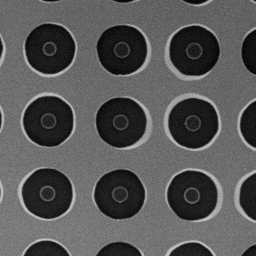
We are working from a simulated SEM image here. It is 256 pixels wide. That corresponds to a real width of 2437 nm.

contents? an array of small figures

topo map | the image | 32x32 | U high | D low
UUUUUUUUUUUUUUUUUUUUUUUUDUUUUUUU
UUUUUUUUUUUUUUUUUUUUUUUUUUUUUUUU
UUUUUUUUUUUUUUUUUUUUUUUUUUUUUUUU
UUUUDDDDUUUUUUDDDUUUUUUDDDUUUUUU
UUUDDDDDDUUUUDDDDDUUUUDDDDDUUUUD
UUUDDDDDDUUUDDDDDDDUUDDDDDDUUUDD
UUUDDDDDDUUUDDDDDDDUUDDDDDDDUUDD
UUUDDDDDDUUUDDDDDDUUUDDDDDDUUUDD
UUUUDDDDUUUUUDDDDDUUUUDDDDDUUUUD
UUUUUUUUUUUUUUUUUUUUUUUDDUUUUUUU
UUUUUUUUUUUUUUUUUUUUUUUUUUUUUUUU
UUUUUUUUUUUUUUUUUUUUUUUUUUUUUUUU
UUUUDDDDUUUUUUDDDUUUUUDDDDUUUUUU
UUUDDDDDDUUUDDDDDDUUUDDDDDDUUUUD
UUUDDDDDDUUUDDDDDDUUUDDDDDDUUUDD
UUUDDDDDDUUUDDDDDDDUUDDDDDDUUUDD
UUUDDDDDDUUUDDDDDDUUUDDDDDDUUUDD
UUUUDDDDUUUUUDDDDDUUUUDDDDDUUUUD
UUUUUUUUUUUUUUUDUUUUUUUDDUUUUUUU
UUUUUUUUUUUUUUUUUUUUUUUUUUUUUUUU
UUUUUUUUUUUUUUUUUUUUUUUUUUUUUUUU
UUUUDDDDUUUUUUDDDUUUUUUDDUUUUUUU
UUUDDDDDDUUUDDDDDDUUUDDDDDDUUUDD
UUUDDDDDDUUUDDDDDDUUUDDDDDDUUUDD
UUUDDDDDDUUUDDDDDDUUUDDDDDDDUUDD
UUUDDDDDDUUUDDDDDDUUUDDDDDDUUUDD
UUUUDDDDUUUUUDDDDUUUUUDDDDDUUUDD
UUUUUUUUUUUUUUUUUUUUUUUDDUUUUUUU
UUUUUUUUUUUUUUUUUUUUUUUUUUUUUUUU
UUUUUUUUUUUUUUUUUUUUUUUUUUUUUUUU
UUUUDDDUUUUUUUDDUUUUUUUDDUUUUUUU
UUUDDDDDUUUUDDDDDDUUUDDDDDUUUUUD